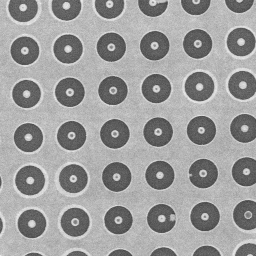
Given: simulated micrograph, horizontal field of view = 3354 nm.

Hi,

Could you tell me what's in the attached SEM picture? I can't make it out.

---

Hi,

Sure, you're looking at an array of small figures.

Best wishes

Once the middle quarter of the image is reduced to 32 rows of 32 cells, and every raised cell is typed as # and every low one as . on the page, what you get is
################################
################################
######################..#######.
...#######....######......#####.
....#####......#####.......###..
.....####.......###........###..
.#...###...##...###...##...###..
.#...####.......###........###..
.....####......#####......#####.
....######....########...#######
...#############################
################################
################################
######################...#######
...#######.....######.....#####.
.....####.......####.......####.
.....####.......####...#...####.
..#...###...#....###...#...####.
......###.......####.......####.
.....#####......#####.....######
.....#####.....#######...#######
...#############################
################################
################################
######################....######
....#######.....#####......#####
......####......####........###.
......###........###...#....###.
..#...###....#...###........###.
......####.......####......#####
......####......#####......#####
.....######....#########.#######